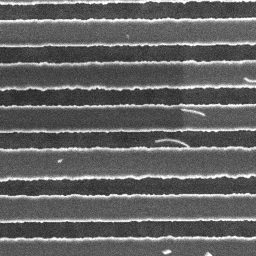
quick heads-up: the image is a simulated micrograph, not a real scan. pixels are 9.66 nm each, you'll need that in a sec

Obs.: lines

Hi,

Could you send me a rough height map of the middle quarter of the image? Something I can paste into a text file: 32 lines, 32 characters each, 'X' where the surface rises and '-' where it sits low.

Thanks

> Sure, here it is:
XXXXXXXXXXXXXXXXXXXXXXXXXXXXXXXX
XXXXXXXXXXXXXXXXXXXXXXXXXXXXXXXX
XXXXXXXXXXXXXXXXXXXXXXXXXXXXXXXX
XXXXXXXXXXXXXXXXXXXXXXXXXXXXXXXX
XXXXXXXXXXXXXXXXXXXXXXXXXXXXXXXX
XXXXXXXXXXXXXXXXXXXXXXXXXXXXXXXX
--------------------------------
--------------------------------
--------------------------------
--------------------------------
--X--XXXXXXXXXXXXXXXXXXXXXXXXXXX
XXXXXXXXXXXXXXXXXXXXXXXXXXXXXXXX
XXXXXXXXXXXXXXXXXXXXXXXXXXXXXXXX
XXXXXXXXXXXXXXXXXXXXXXXXXXXXXXXX
XXXXXXXXXXXXXXXXXXXXXXXXXXXXXXXX
XXXXXXXXXXXXXXXXXXXXXXXXXXXXXXXX
XXXXXXXXXXXXXXXXXXXXXXXXXXXXXXXX
--------------------------------
--------------------------------
--------------------------------
--------------------------------
XXXXXXXXXXXXXXXXXXXXXXXXXXXXXXXX
XXXXXXXXXXXXXXXXXXXXXXXXXXXXXXXX
XXXXXXXXXXXXXXXXXXXXXXXXXXXXXXXX
XXXXXXXXXXXXXXXXXXXXXXXXXXXXXXXX
XXXXXXXXXXXXXXXXXXXXXXXXXXXXXXXX
XXXXXXXXXXXXXXXXXXXXXXXXXXXXXXXX
XXXXXXXXXXXXXXXXXXXXXXXXXXXXXXXX
XXXXX-X----XX----XX-------------
--------------------------------
--------------------------------
--------------------------------